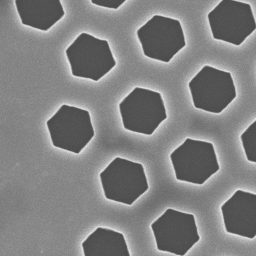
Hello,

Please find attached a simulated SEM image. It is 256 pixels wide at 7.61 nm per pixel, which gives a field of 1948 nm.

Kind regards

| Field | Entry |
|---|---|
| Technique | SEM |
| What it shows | holes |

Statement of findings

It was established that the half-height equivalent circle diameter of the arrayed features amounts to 346 nm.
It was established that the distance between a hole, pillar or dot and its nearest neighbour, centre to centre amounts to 551 nm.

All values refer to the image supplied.